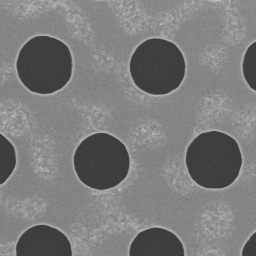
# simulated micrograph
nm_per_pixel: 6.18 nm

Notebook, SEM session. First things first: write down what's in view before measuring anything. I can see holes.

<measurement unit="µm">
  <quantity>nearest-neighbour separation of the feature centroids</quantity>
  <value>0.675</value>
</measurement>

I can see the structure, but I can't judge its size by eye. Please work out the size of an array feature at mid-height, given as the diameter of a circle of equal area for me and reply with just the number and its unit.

348 nm